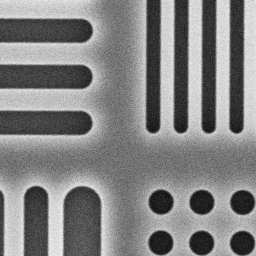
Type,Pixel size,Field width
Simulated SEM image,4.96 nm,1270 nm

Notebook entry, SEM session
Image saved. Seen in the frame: groups of lines, slits or small figures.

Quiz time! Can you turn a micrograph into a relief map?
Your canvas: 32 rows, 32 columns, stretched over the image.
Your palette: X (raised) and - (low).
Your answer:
XXXXXXXXXXXXXXXXXX--XX--X--XX--X
XXXXXXXXXXXXXXXXXX--XX--X--XX--X
-----------XXXXXXX--XX--X--XX--X
------------XXXXXX--XX--X--XX--X
-----------XXXXXXX--XX--X--XX--X
XXXXXXXXXXXXXXXXXX--XX--X--XX--X
XXXXXXXXXXXXXXXXXX--XX--X--XX--X
XXXXXXXXXXXXXXXXXX--XX--X--XX--X
-----------XXXXXXX--XX--X--XX--X
------------XXXXXX--XX--X--XX--X
-----------XXXXXXX--XX--X--XX--X
XXXXXXXXXXXXXXXXXX--XX--X--XX--X
XXXXXXXXXXXXXXXXXX--XX--X--XX--X
XXXXXXXXXXXXXXXXXX--XX--X--XX--X
-----------XXXXXXX--XX--X--XX--X
------------XXXXXX--XX--X--XX--X
-----------XXXXXXXX-XX-XXX-XX-XX
XXXXXXXXXXXXXXXXXXXXXXXXXXXXXXXX
XXXXXXXXXXXXXXXXXXXXXXXXXXXXXXXX
XXXXXXXXXXXXXXXXXXXXXXXXXXXXXXXX
XXXXXXXXXXXXXXXXXXXXXXXXXXXXXXXX
XXXXXXXXXXXXXXXXXXXXXXXXXXXXXXXX
XXXXXXXXXXXXXXXXXXXXXXXXXXXXXXXX
XXXX-XXXX--XXXXXXXXXXXXXXXXXXXXX
XXX---XX----XXXXXXX--XXX---XX---
-XX---XX-----XXXXXX---XX---XX---
-XX---XX-----XXXXXX--XXX--XXX--X
-XX---XX-----XXXXXXXXXXXXXXXXXXX
-XX---XX-----XXXXXXXXXXXXXXXXXXX
-XX---XX-----XXXXXX--XXX--XXX---
-XX---XX-----XXXXXX---XX---XX---
-XX---XX-----XXXXXX--XXX--XXX--X